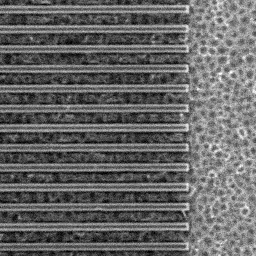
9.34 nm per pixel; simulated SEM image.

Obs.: parallel lines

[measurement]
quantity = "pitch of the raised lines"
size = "185 nanometers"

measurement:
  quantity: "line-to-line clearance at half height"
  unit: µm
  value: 0.124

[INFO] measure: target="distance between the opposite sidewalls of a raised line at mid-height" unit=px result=6.63